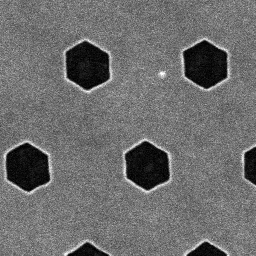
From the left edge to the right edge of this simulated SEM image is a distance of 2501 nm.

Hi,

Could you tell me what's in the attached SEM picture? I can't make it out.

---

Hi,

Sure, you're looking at holes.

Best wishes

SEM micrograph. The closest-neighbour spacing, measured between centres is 1140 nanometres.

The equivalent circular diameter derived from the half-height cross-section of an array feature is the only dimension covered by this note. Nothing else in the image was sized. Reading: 447 nm